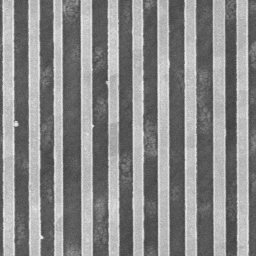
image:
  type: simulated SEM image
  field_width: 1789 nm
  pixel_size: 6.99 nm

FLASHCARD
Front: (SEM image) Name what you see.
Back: parallel lines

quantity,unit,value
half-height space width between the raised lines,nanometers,110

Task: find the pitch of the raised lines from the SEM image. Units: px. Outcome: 26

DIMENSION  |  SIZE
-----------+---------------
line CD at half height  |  70.8 nm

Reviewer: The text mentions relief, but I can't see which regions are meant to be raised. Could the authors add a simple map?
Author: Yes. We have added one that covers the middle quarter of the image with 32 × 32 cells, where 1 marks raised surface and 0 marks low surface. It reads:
00000110000110000111000011000011
00000110000110000111000011000011
00000110000110000111000011000011
00000110000110000111000011000011
00000110000110000111000011000011
00000110000110000111000011000011
00001110000110000111000011000011
00001110000110000111000011000011
00000110000110000111000011000011
00000110000110000111000011000011
00000110000110000111000011000011
00000110000110000111000011000011
00000110000110000111000011000001
00001110000110000111000011000001
00001110000110000111000011000001
00001110000110000111000011000001
00001110000110000111000011000001
00000110000110000111000011000001
00001110000110000111000011000001
00000110000110000111000011000001
00000110000110000111000011000001
00001110000110000111000011000001
00000110000110000111000011000001
00000110000110000111000011000001
00000110000110000111000011000001
00000110000110000111000011000001
00000110000110000111000011000001
00000110000110000111000011000001
00001110000110000111000011000001
00001110000110000111000011000001
00001110000110000111000011000001
00001110000110000111000011000001